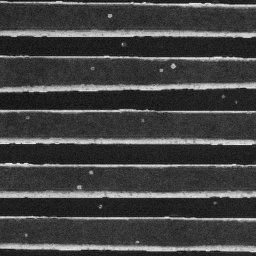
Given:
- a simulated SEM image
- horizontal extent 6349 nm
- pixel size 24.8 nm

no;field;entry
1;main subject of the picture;lines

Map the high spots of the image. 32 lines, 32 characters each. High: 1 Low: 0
11111111111111111100000000000000
11111111111111111111111111111111
11111111111111111111111111111111
11111111111111111111111111111111
00000000000000000000000000000000
00000000000000000000000000000000
00000000000000000000000000000000
11111111111111111111111111111111
11111111111111111111111111111111
11111111111111111111111111111111
11111111111111111111111111111111
00000000000000000000000000000000
00000000000000000000000000000000
00000000000000000000000000000000
11111111111111111111111111111111
11111111111111111111111111111111
11111111111111111111111111111111
11111111111111111111111111111111
00000000000000000000000000000000
00000000000000000000000000000000
00000000000000000000000000000000
11111111111111111111111111111111
11111111111111111111111111111111
11111111111111111111111111111111
00000000000000000000000000000000
00000000000000000000000000000000
00000000000000000000000000000000
11111111111111111111111111111111
11111111111111111111111111111111
11111111111111111111111111111111
11111111111111111111111111111111
00000000000000000000000000000000